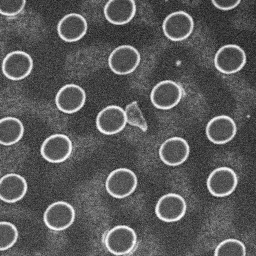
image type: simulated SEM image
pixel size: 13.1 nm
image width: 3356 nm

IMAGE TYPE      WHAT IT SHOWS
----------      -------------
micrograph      a regular array of raised bodies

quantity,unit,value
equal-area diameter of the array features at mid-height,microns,0.367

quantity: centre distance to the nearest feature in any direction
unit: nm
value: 720